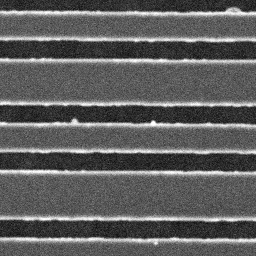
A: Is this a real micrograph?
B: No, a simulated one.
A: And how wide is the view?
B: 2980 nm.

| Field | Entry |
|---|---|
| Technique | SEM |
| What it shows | lines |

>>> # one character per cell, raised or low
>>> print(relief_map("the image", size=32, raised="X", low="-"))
--------------------------------
XXXXXXXXXXXXX---XX--------------
XXXXXXXXXXXXXXXXXXXXXXXXXXXXXXXX
XXXXXXXXXXXXXXXXXXXXXXXXXXXXXXXX
XXXXXXXXXXXXXXXXXXXXXXXXXXXXXXXX
--------------------------------
--------------------------------
XXXXXXXXXXXXXXXXXXX-X--XXX------
XXXXXXXXXXXXXXXXXXXXXXXXXXXXXXXX
XXXXXXXXXXXXXXXXXXXXXXXXXXXXXXXX
XXXXXXXXXXXXXXXXXXXXXXXXXXXXXXXX
XXXXXXXXXXXXXXXXXXXXXXXXXXXXXXXX
XXXXXXXXXXXXXXXXXXXXXXXXXXXXXXXX
--------------------------------
--------------------------------
XXXXXXXXXXXXXXXXX-XXXXX--XX-----
XXXXXXXXXXXXXXXXXXXXXXXXXXXXXXXX
XXXXXXXXXXXXXXXXXXXXXXXXXXXXXXXX
XXXXXXXXXXXXXXXXXXXXXXXXXXXXXXXX
--------------------------------
--------------------------------
XXXXXXXXXXXXXXXXXXXXXXX-XXXX-X--
XXXXXXXXXXXXXXXXXXXXXXXXXXXXXXXX
XXXXXXXXXXXXXXXXXXXXXXXXXXXXXXXX
XXXXXXXXXXXXXXXXXXXXXXXXXXXXXXXX
XXXXXXXXXXXXXXXXXXXXXXXXXXXXXXXX
XXXXXXXXXXXXXXXXXXXXXXXXXXXXXXXX
-------------------------XXXXX-X
--------------------------------
--------------------------------
XXXXXXXXXXXXXXXXXXXXXXXXXXXXXXXX
XXXXXXXXXXXXXXXXXXXXXXXXXXXXXXXX